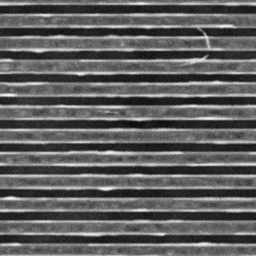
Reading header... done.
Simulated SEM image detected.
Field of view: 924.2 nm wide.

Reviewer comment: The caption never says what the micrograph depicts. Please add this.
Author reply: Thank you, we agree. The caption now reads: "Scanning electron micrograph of parallel lines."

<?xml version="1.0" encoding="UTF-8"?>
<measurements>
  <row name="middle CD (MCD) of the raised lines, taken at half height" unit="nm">51.9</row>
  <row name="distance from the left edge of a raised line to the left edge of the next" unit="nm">83.2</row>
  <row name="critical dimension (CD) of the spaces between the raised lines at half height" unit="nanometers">29.3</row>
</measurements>